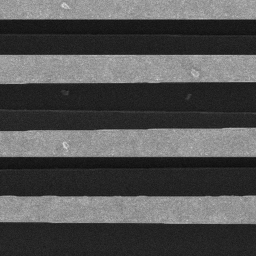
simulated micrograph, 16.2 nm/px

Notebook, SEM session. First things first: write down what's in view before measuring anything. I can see lines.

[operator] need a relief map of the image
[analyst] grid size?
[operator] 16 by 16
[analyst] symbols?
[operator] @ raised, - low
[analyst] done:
@@@@@@@@@@@@@@@@
----------------
----------------
@@@@@@@@@@@@@@@@
@@@@@@@@@@@@@@@@
----------------
----------------
----------------
@@@@@@@@@@@@@@@@
@@@@@@@@@@@@@@@@
----------------
----------------
@@@@@@@@@@@@@@@@
@@@@@@@@@@@@@@@@
----------------
----------------